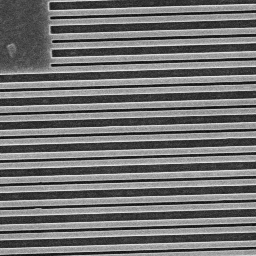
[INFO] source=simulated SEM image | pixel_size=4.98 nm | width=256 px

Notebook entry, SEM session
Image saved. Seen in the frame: parallel lines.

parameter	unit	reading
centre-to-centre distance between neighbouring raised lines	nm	58.8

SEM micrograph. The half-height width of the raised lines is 31.7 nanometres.